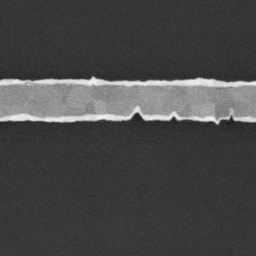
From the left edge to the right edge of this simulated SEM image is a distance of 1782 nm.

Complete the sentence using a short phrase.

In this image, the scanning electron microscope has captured one or a few lines or trenches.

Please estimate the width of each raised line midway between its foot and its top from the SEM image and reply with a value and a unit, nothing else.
260 nm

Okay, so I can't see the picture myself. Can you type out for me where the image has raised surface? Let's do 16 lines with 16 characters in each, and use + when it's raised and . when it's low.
................
................
................
................
................
++++++++++++++++
++++++++++++++++
...+........++.+
................
................
................
................
................
................
................
................